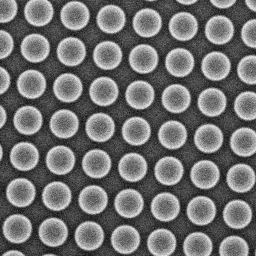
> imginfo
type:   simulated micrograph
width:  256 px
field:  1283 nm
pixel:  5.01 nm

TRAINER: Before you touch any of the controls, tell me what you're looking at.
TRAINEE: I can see an array of small figures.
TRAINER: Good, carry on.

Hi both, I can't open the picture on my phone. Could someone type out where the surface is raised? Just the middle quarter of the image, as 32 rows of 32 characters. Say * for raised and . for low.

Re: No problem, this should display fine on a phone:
.........****....******...******
..................****....******
...........................****.
***......**.....................
****...******.....**............
****...******...******.....**...
****...******...******...******.
****..*******...******...******.
***....******...******...******.
........****....******...******.
.................****....******.
..........................****..
***.....**......................
***...******.....**.............
****..******....*****.....**....
***...*******..******....*****..
***...******...******...******..
***...******...******...*******.
.......****....******...******..
................****....******..
.........................****...
**..............................
**....*****.....**..............
***..******....*****.....***....
***..*******..******....*****...
**...*******..*******..******...
**...******...*******..*******..
......*****...******...*******..
...............****....******...
........................****....
*...............................
*....*****.....**...............